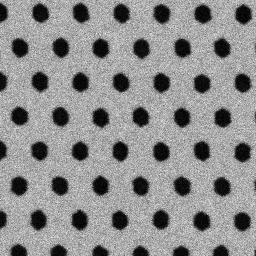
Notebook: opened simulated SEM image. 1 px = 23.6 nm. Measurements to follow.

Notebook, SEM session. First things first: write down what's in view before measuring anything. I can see a regular array of holes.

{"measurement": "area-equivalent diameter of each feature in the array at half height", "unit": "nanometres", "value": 437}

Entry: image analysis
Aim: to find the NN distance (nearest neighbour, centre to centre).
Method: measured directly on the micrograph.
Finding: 933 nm